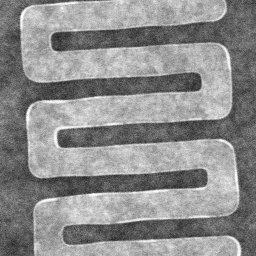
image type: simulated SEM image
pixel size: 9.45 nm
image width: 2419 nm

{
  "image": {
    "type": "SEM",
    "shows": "groups of lines, slits or small figures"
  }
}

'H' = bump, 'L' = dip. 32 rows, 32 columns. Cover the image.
LLLLLLLLHHHHHHHHHHHHHHHHHHHHLLLL
LLLHHHHHHHHHHHHHHHHHHHHHHHHHLLLL
LLLHHHHHHHHHHHHHHHHHHHHHHHHLLLLL
LLLHHHHHHHHHHHHHLLLLLLLLLLLLLLLL
LLLHHHLLLLLLLLLLLLLLLLLLLLLLLLLL
LLLHHHLLLLLLLLLLLLLLLLLLLHHLLLLL
LLLHHHHLHHHHHHHHHHHHHHHHHHHHLLLL
LLLHHHHHHHHHHHHHHHHHHHHHHHHHHLLL
LLLHHHHHHHHHHHHHHHHHHHHHHHHHHLLL
LLLHHHHHHHHHHHHHHHLLLLLLLHHHHLLL
LLLLLLLLLLLLLLLLLLLLLLLLLHHHHLLL
LLLLLLLLLLLLLLLLLLLLLLLLHHHHHLLL
LLLLLLLLLHHHHHHHHHHHHHHHHHHHHLLL
LLLLHHHHHHHHHHHHHHHHHHHHHHHHHLLL
LLLHHHHHHHHHHHHHHHHHHHHHHHHHLLLL
LLLHHHHHHHHHHHHLLLLLLLLLLLLLLLLL
LLLHHHHLLLLLLLLLLLLLLLLLLLLLLLLL
LLLLHHHLLLLLLLLLLLLLLLLLLLLLLLLL
LLLLHHHHLLLLHHHHHHHHHHHHHHHHHLLL
LLLLHHHHHHHHHHHHHHHHHHHHHHHHHLLL
LLLLHHHHHHHHHHHHHHHHHHHHHHHHHLLL
LLLLHHHHHHHHHHHHHHHHLLLLLLHHHLLL
LLLLLLLLLLLLLLLLLLLLLLLLLLHHHHLL
LLLLLLLLLLLLLLLLLLLLLLLLLHHHHHLL
LLLLLLLLLHHHHHHHHHHHHHHHHHHHHHLL
LLLLLHHHHHHHHHHHHHHHHHHHHHHHHHLL
LLLLHHHHHHHHHHHHHHHHHHHHHHHHHLLL
LLLLHHHHHHHHHHHHHLLLLLLLLLLLLLLL
LLLLHHHHLLLLLLLLLLLLLLLLLLLLLLLL
LLLLHHHHLLLLLLLLLLLLLLLLLLLLLLLL
LLLLHHHHLLLHHHHHHHHHHHHHHHHHHHLL
LLLLHHHHHHHHHHHHHHHHHHHHHHHHHHLL